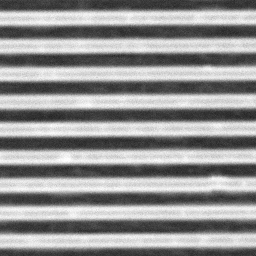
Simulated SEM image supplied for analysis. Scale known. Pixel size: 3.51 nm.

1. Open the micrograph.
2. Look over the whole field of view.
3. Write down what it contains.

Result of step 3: parallel lines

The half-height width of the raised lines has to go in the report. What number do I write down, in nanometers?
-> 44.3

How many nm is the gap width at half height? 53.5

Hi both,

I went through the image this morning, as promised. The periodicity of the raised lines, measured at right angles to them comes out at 97.6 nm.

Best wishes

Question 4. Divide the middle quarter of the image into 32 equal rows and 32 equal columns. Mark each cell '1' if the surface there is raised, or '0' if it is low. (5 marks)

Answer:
00000000000000000000000000000000
11111111111111111111111111111111
11111111111111111111111111111111
11111111111111111111111111111111
00000000000000000000000000000000
00000000000000000000000000000000
00000000000000000000000000000000
00000000000000000000000000000000
11111111111111111111111111111111
11111111111111111111111111111111
11111111111111111111111111111111
00000000000000000000000000000000
00000000000000000000000000000000
00000000000000000000000000000000
00000000000000000000000000000000
11111111111111111111111111111111
11111111111111111111111111111111
11111111111111111111111111111111
00000000000000000000000000000000
00000000000000000000000000000000
00000000000000000000000000000000
00000000000000000000000000000000
11111111111111111111111111111111
11111111111111111111111111111111
11111111111111111111111111111111
00000000000000000000000000000000
00000000000000000000000000000000
00000000000000000000000000000000
00000000000000000000000000000000
11111111111111111111111111111111
11111111111111111111111111111111
11111111111111111111111111111111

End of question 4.